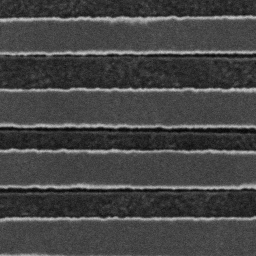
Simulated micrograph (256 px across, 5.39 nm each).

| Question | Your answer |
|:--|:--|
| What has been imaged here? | lines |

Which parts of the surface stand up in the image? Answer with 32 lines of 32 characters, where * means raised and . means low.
................................
................................
********************************
********************************
********************************
********************************
********************************
................................
................................
................................
................................
********************************
********************************
********************************
********************************
********************************
................................
................................
................................
********************************
********************************
********************************
********************************
*..*.****.**********************
................................
................................
................................
********************************
********************************
********************************
********************************
********************************